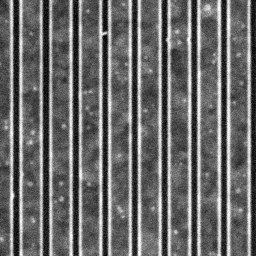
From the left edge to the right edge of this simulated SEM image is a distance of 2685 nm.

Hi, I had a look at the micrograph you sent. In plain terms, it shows parallel lines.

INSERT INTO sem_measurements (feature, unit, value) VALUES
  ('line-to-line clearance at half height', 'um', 0.0879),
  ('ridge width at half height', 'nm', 215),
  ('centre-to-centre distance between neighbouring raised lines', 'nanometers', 311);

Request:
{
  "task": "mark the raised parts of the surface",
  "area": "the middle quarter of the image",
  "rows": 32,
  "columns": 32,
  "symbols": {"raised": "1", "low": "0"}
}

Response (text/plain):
11001111100011110001111100111110
11001111100011110001111100111110
11001111100011110001111100111110
11001111100011110001111100111110
11001111100011110001111100111110
11001111100011110001111100111110
11001111100011110001111100111110
11001111100011110001111100111110
11001111100011110001111100111110
11001111100011110001111100111110
11001111100011110001111100111110
11001111100011110001111100111110
11001111100011110001111100111110
11001111100011110001111100111110
11001111100011110001111100111110
11001111100011110001111100111110
11001111100011110001111100111110
11001111100011110001111100111110
11001111100011110001111100111110
11001111100011110001111100111110
11001111100011110001111100111110
11001111100011110001111100111110
11001111100011110001111100111110
11001111100011110001111100111110
11001111100011110001111100111110
11001111100011110001111100111110
11001111100011110001111100111110
11001111100011110001111100111110
11001111100011110001111100111110
11001111100011110001111100111110
11001111100011110001111100111110
11001111100011110001111100111110